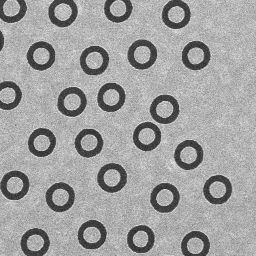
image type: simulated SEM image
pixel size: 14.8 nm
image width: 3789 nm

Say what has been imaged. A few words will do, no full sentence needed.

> a regular array of ring-shaped grooves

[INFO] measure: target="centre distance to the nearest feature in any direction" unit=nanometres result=664